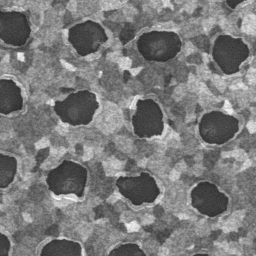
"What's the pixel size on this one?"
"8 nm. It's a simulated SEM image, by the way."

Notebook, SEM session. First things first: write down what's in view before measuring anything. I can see a regular array of holes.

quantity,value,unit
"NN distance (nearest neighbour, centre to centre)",569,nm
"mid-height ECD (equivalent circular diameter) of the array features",0.306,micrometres